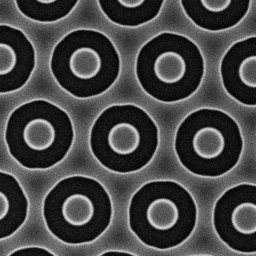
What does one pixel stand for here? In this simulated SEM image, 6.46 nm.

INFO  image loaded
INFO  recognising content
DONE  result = an array of small figures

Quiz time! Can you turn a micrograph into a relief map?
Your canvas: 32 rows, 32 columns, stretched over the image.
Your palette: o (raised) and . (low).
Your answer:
oo........oo....o...ooo...oo...o
ooo......oooo.......ooo........o
oooo...ooooooo.....ooooo......oo
..ooooooooooooooooooooooo....ooo
...ooooo.....ooooooo...ooooooooo
....ooo.......oooo......ooooo...
o...ooo...oo...oo........ooo....
oo..oo...ooo...oo...ooo..ooo...o
o...oo...ooo...oo...ooo...oo..oo
....ooo...o....oo...oo...ooo..oo
...oooo.......oooo.......ooo...o
.oooooooo....ooooo......oooo....
oooo.ooooooooooooooo...ooooooo..
oo......ooooo.....oooooooooooooo
o........ooo.......oooo......ooo
o...oo...ooo.......oooo.......oo
o..oooo..oo...ooo...oo...oo...oo
o..ooo...oo...ooo...oo..oooo..oo
o........oo...ooo...oo...ooo..oo
o.......oooo.......ooo........oo
ooo....oooooo.....ooooo.......oo
ooooooooooooooo.oooooooo....oooo
..oooooo....oooooooooooooooooooo
...oooo......ooooo.....oooooo...
...ooo........ooo.......oooo....
o...o...ooo...oo...oo...ooo.....
o..oo...ooo...oo...ooo...oo..ooo
...ooo...oo...oo...ooo...oo..ooo
..oooo.......ooo........ooo...oo
.oooooo.....ooooo.......ooo.....
ooooooooo.oooooooo....oooooo....
oo....ooooooo...oooooooooooooo..